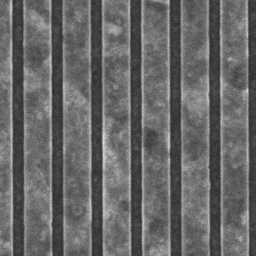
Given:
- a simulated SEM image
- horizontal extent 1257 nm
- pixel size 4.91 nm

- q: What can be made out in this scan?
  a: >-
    parallel lines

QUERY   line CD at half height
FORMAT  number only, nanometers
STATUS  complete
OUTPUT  131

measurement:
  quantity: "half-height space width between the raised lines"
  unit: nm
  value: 60.7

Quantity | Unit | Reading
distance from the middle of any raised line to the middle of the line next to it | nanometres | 193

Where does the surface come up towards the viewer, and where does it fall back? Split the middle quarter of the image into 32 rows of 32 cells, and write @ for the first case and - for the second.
@@@@@@----@@@@@@----@@@@@@----@@
@@@@@@----@@@@@@----@@@@@@----@@
@@@@@@----@@@@@@----@@@@@@----@@
@@@@@@----@@@@@@----@@@@@@----@@
@@@@@@@---@@@@@@----@@@@@@----@@
@@@@@@@---@@@@@@----@@@@@@----@@
@@@@@@@---@@@@@@----@@@@@@----@@
@@@@@@@---@@@@@@----@@@@@@----@@
@@@@@@@---@@@@@@----@@@@@@----@@
@@@@@@@---@@@@@@----@@@@@@----@@
@@@@@@@---@@@@@@----@@@@@@----@@
@@@@@@@---@@@@@@----@@@@@@----@@
@@@@@@@---@@@@@@----@@@@@@----@@
@@@@@@@---@@@@@@----@@@@@@----@@
@@@@@@@---@@@@@@----@@@@@@----@@
@@@@@@@---@@@@@@----@@@@@@----@@
@@@@@@@---@@@@@@----@@@@@@----@@
@@@@@@@---@@@@@@----@@@@@@----@@
@@@@@@@---@@@@@@----@@@@@@----@@
@@@@@@@---@@@@@@----@@@@@@----@@
@@@@@@@---@@@@@@----@@@@@@----@@
@@@@@@@---@@@@@@----@@@@@@----@@
@@@@@@@---@@@@@@----@@@@@@----@@
@@@@@@@---@@@@@@----@@@@@@----@@
@@@@@@@---@@@@@@----@@@@@@----@@
@@@@@@@---@@@@@@----@@@@@@----@@
@@@@@@@---@@@@@@----@@@@@@----@@
@@@@@@@---@@@@@@----@@@@@@----@@
@@@@@@@---@@@@@@----@@@@@@----@@
@@@@@@@---@@@@@@----@@@@@@----@@
@@@@@@@---@@@@@@----@@@@@@----@@
@@@@@@@---@@@@@@----@@@@@@----@@